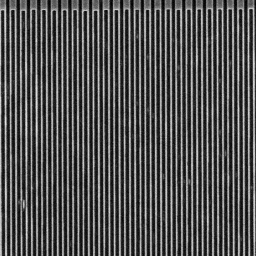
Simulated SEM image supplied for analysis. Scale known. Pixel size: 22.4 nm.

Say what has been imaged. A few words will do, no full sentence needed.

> parallel lines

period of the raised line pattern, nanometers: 116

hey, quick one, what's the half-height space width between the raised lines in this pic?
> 86.8 nm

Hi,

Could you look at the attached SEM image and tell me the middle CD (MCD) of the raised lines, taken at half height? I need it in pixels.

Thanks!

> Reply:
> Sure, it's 1.13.